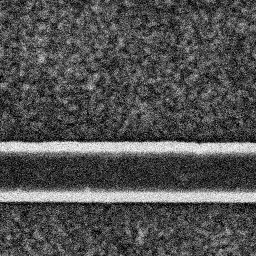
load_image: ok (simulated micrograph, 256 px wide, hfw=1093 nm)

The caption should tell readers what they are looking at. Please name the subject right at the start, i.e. one or a few lines or trenches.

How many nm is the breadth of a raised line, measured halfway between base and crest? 223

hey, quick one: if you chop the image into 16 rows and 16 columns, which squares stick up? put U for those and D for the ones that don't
DDDDDDDDDDDDDDDD
DDDDDDDDDDDDDDDD
DDDDDDDDDDDDDDDD
DDDDDDDDDDDDDDDD
DDDDDDDDDDDDDDDD
DDDDDDDDDDDDDDDD
DDDDDDDDDDDDDDDD
DDDDDDDDDDDDDDDD
DDDDDDDDDDDDDDDD
UUUUUUUUUUUUUUUU
UUUUUUUUUUUUUUUU
UUUUUUUUUUUUUUUU
DDDDDDDDDDDDDDDD
DDDDDDDDDDDDDDDD
DDDDDDDDDDDDDDDD
DDDDDDDDDDDDDDDD